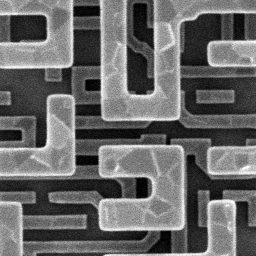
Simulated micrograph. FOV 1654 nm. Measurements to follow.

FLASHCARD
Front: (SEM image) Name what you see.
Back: wiring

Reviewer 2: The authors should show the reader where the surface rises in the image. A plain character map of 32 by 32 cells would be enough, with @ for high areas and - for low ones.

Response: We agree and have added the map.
@@@@@@@@@----@@@---@@@@@@@@@@@@@
@@@@@@@@@----@@@---@@@@@@@@@@@@@
------@@@----@@@---@@@@@--------
------@@@----@@@---@@@----------
------@@@----@@@---@@@----------
@@@@@@@@@----@@@---@@@----@@@@@@
@@@@@@@@@----@@@---@@@----@@@@@@
@@@@@@@@@----@@@---@@@----@@@@@@
-------------@@@---@@@----------
-------------@@@---@@@----------
-------------@@@---@@@----------
-------------@@@---@@@----------
------@@@----@@@@@@@@@----------
------@@@----@@@@@@@@@----------
------@@@----@@@@@@@@@----------
------@@@-----------------------
------@@@-----------------------
------@@@-----------------------
-----@@@@----@@@@@@@@@@---@@@@@@
@@@@@@@@@---@@@@@@@@@@@---@@@@@@
@@@@@@@@@---@@@@@@@@@@@---@@@@@@
@@@@@@@@@---@@@@@@@@@@@---@@@@@@
-------------------@@@@---------
-------------------@@@@---------
-------------------@@@@---------
@@----------@@@@@@@@@@@---@@@---
@@@---------@@@@@@@@@@@---@@@---
@@@---------@@@@@@@@@@@---@@@---
@@@----------@@@@@@@@@@---@@@---
@@@-----------------------@@@---
@@@-----------------------@@@---
@@@-----------------------@@@---